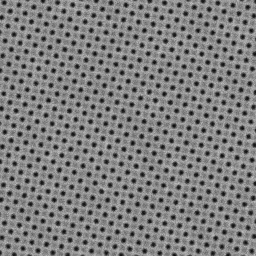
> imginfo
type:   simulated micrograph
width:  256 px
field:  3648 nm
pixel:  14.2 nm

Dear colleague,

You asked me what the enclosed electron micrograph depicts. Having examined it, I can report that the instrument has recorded a regular array of holes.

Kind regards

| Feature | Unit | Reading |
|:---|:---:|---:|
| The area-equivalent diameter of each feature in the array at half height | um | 0.082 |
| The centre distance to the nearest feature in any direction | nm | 148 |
